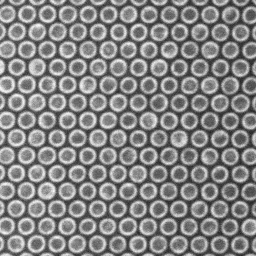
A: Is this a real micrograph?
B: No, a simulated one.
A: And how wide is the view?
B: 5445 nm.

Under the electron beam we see a regular array of raised bodies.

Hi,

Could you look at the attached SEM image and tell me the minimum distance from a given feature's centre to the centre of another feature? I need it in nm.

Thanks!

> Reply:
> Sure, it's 428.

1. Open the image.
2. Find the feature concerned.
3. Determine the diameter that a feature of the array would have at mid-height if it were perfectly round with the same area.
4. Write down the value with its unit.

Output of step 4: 324 nanometers